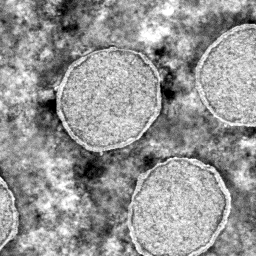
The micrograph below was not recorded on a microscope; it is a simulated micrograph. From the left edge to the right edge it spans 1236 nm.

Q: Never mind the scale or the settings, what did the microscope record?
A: raised bodies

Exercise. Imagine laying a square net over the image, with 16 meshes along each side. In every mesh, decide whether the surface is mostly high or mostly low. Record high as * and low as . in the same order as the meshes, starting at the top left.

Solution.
................
................
..............**
.....****....***
....******..****
....******..****
....******...***
....******....**
....*****.......
................
..........***...
.........*****..
*.......******..
*.......******..
*.......******..
.........****...